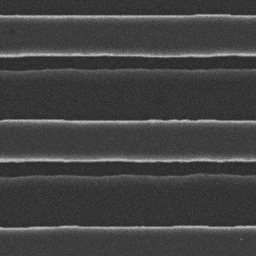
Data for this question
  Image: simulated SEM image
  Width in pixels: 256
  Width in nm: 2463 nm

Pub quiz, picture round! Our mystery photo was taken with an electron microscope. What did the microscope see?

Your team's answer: lines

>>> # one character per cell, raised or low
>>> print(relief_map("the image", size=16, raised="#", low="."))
................
################
################
.........###....
................
................
................
................
################
################
................
................
................
................
################
################